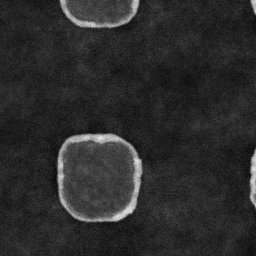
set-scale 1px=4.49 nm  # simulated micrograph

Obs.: raised bodies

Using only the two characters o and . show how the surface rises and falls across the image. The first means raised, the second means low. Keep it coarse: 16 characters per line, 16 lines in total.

....ooooo.......
.....ooo........
................
................
................
................
................
................
......o.........
....oooo........
....ooooo.......
....ooooo.......
....ooooo.......
.....ooo........
................
................